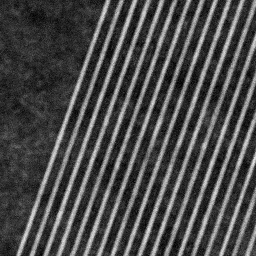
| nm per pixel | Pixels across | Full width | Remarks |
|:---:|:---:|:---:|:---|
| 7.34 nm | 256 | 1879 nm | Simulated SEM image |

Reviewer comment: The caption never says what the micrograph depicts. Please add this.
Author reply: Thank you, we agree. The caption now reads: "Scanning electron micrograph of parallel lines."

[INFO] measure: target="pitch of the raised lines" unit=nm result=93.1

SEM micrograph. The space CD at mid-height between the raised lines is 71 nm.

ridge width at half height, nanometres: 19.1